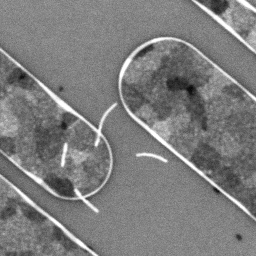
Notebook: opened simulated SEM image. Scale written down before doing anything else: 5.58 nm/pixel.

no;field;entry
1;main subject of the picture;groups of lines, slits or small figures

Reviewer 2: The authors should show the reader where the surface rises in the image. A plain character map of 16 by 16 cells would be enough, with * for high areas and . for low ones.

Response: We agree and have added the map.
.............***
..............**
..........*....*
*.......*****...
**......******..
***.....*******.
****....********
*****....*******
******....******
*******....*****
.******.....****
*..***.......***
**.............*
***.............
****............
*****...........